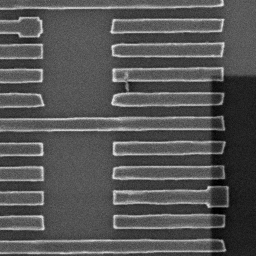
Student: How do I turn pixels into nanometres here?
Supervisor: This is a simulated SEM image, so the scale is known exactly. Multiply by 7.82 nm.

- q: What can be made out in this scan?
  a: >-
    wiring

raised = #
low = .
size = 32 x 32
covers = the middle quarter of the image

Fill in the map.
................................
............####################
............####################
............####################
...............#................
................................
................................
..............##################
............####################
............####################
................................
................................
................................
.............###################
################################
################################
#####################...........
................................
................................
................###.......######
............####################
............####################
............####################
................................
................................
................................
............####################
............####################
............####################
................................
................................
................................